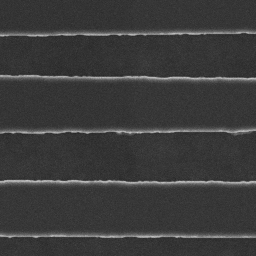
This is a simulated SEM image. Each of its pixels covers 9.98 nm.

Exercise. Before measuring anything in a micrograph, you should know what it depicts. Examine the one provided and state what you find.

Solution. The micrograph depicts lines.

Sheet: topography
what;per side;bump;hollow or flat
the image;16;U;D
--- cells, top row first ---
UUUUUUUUUUUUUUUU
UUUUUUUUUUUUUUUU
DDDDDDDDDDDDDDDD
DDDDDDDDDDDDDDDD
DDDDDDDDDDDDDDDD
UUUUUUUUUUUUUUUU
UUUUUUUUUUUUUUUU
UUUUUUUUUUUUUUUU
DDDDDDDDDDDDDDDD
DDDDDDDDDDDDDDDD
DDDDDDDDDDDDDDDD
UUUUUUUUUUUUUUUU
UUUUUUUUUUUUUUUU
UUUUUUUUUUUUUUUU
UUUUUUUUUUUUUUUU
DDDDDDDDDDDDDDDD